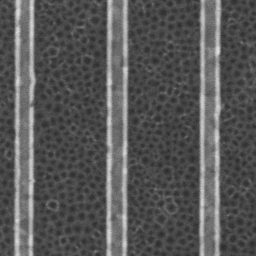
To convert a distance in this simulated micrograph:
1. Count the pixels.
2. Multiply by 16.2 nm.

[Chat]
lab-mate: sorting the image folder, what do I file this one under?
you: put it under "one or a few lines or trenches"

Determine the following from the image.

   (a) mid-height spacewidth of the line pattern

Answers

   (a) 1260 nanometres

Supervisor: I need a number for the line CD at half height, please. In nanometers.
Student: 245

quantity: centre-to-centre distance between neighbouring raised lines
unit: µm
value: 1.5